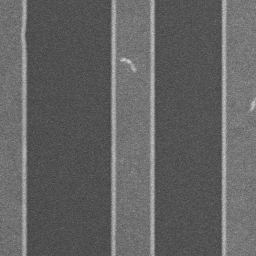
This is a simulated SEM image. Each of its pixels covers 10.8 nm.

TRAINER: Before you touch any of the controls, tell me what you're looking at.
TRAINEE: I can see one or a few lines or trenches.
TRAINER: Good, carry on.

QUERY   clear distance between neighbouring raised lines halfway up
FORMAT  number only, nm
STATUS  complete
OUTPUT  871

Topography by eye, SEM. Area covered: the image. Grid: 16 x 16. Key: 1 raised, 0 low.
1100000110000011
1100000110000011
1000000110000011
1100000110000011
1100000110000011
1100000110000011
1100000110000011
1100000110000011
1100000110000011
1100000110000011
1100000110000011
1100000110000011
1100000110000011
1100000110000011
1000000110000011
1000000110000011